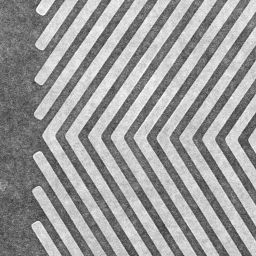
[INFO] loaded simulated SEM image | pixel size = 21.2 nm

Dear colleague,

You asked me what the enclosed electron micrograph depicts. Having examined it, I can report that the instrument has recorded groups of lines, slits or small figures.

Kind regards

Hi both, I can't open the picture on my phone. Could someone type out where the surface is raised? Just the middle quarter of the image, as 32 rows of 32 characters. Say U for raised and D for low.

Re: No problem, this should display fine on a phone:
DUUUDDUUUDDDUUUDDDUUUDDDUUUDDDUU
UUUDDDUUUDDDUUUDDUUUDDDUUUDDDUUU
UUDDDUUUDDDUUUDDDUUUDDDUUDDDUUUD
UUDDUUUDDDUUUDDDUUUDDDUUUDDDUUUD
UDDDUUUDDUUUUDDUUUDDDUUUDDDUUUDD
DDDUUUDDDUUUDDDUUUDDUUUDDDUUUDDD
DDUUUDDDUUUDDDUUUDDDUUUDDDUUUDDU
DDUUUDDUUUDDDUUUDDDUUUDDDUUUDDDU
DUUUDDDUUUDDDUUUDDUUUDDDUUUDDDUU
UUUDDDUUUDDDUUUDDDUUDDDDUUDDDUUU
UUUDDUUUDDDUUUDDDUUUDDDUUUDDDUUU
UUDDDUUUDDUUUDDDUUUDDDUUUDDDUUUD
UDDDUUUDDDUUUDDDUUDDDDUUDDDUUUDD
DDDUUUDDDUUUDDDUUUDDDUUUDDDUUDDD
DDDUUUDDUUUDDDUUUDDDUUUDDDUUUDDD
DDUUUDDDUUUDDDUUUDDUUUDDDUUUDDDU
DUUUDDDUUUDDDUUUDDDUUUDDDUUDDDUU
DUUUDDUUUDDDUUUDDDUUUDDDUUUDDDUU
DUUUDDUUUDDDUUUDDDUUDDDUUUDDDUUU
DUUUDDDUUUDDUUUDDDUUUDDDUUUDDUUU
DDUUUDDUUUDDDUUUDDDUUUDDUUUDDDUU
DDUUUDDDUUUDDDUUUDDUUUDDDUUUDDDU
DDDUUUDDDUUUDDUUUDDDUUUDDUUUUDDU
UDDDUUUDDUUUDDDUUUDDDUUUDDUUUDDD
UUDDUUUDDDUUUDDDUUDDDUUUDDDUUUDD
UUDDDUUUDDDUUDDDUUUDDDUUUDDUUUDD
UUUDDDUUDDDUUUDDDUUUDDUUUDDDUUUD
UUUDDDUUUDDDUUUDDUUUDDDUUUDDDUUU
DUUUDDDUUUDDUUUDDDUUUDDDUUUDDUUU
DDUUUDDUUUDDDUUUDDDUUUDDUUUDDDUU
DDUUUDDDUUUDDDUUUDDUUUDDDUUUDDDU
DDDUUUDDDUUUDDUUUDDDUUUDDUUUUDDU